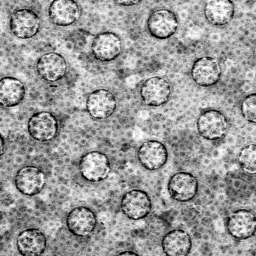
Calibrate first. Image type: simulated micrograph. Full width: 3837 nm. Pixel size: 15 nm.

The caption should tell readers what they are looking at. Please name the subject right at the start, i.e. a regular array of holes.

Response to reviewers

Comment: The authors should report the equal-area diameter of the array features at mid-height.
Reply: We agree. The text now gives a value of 464 nanometres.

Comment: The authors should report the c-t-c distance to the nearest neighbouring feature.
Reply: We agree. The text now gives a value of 54.7 px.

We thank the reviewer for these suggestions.